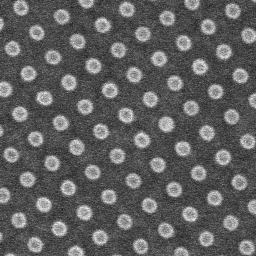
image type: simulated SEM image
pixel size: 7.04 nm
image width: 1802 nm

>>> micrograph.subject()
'a regular array of raised bodies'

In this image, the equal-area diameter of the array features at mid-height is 96.9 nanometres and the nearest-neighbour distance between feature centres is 205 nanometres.